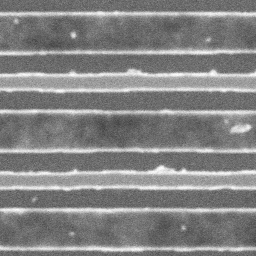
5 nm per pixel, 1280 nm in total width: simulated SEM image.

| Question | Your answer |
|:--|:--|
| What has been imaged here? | lines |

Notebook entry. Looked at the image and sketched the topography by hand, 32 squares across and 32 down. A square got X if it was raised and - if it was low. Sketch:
--------------------------------
--------------------------------
XXXXXXXXXXXXXXXXXXXXXXXXXXXXXXXX
XXXXXXXXXXXXXXXXXXXXXXXXXXXXXXXX
XXXXXXXXXXXXXXXXXXXXXXXXXXXXXXXX
XXXXXXXXXXXXXXXXXXXXXXXXXXXXXXXX
XXXXXXXXXXXXXXXXXXXXXXXXXXX-----
--------------------------------
--------------------------------
XXXXXXXXXXXXXXXXXXXXXXXXXXXXXXXX
XXXXXXXXXXXXXXXXXXXXXXXXXXXXXXXX
--------------------------------
--------------------------------
--------------------------------
XXXXXXXXXXXXXXXXXXXXXXXXXXXXXXXX
XXXXXXXXXXXXXXXXXXXXXXXXXXXXXXXX
XXXXXXXXXXXXXXXXXXXXXXXXXXXXXXXX
XXXXXXXXXXXXXXXXXXXXXXXXXXXXXXXX
XXXXXXXXXXXXXXXXXXXXXXXXXXXXXXXX
--------------------------------
--------------------------------
------------XXXXX-XXX---------XX
XXXXXXXXXXXXXXXXXXXXXXXXXXXXXXXX
XXXXXXXXXX--X----XXXXXXXXXX--XXX
--------------------------------
--------------------------------
XXXXXXXXXXXXXXXXXXXXXXXXXXXXXXXX
XXXXXXXXXXXXXXXXXXXXXXXXXXXXXXXX
XXXXXXXXXXXXXXXXXXXXXXXXXXXXXXXX
XXXXXXXXXXXXXXXXXXXXXXXXXXXXXXXX
XXXXXXXXXXXXXXXXXXXXXXXXXXXXXXXX
--------------------------------